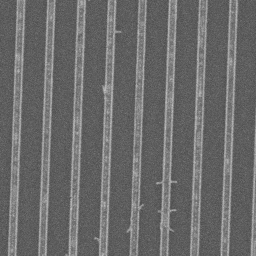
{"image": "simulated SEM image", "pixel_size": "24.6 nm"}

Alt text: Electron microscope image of parallel lines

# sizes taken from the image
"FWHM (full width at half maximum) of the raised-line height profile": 169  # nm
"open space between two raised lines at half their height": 568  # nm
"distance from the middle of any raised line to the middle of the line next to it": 747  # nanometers